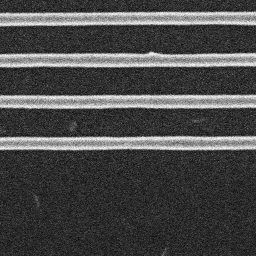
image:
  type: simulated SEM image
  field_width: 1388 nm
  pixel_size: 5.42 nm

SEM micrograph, parallel lines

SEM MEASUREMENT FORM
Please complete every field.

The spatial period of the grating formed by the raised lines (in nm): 225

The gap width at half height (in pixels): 30.4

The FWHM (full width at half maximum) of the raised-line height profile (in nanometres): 59.6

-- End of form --